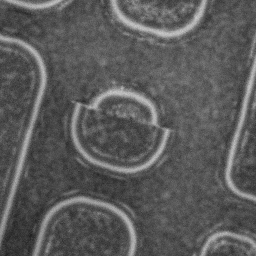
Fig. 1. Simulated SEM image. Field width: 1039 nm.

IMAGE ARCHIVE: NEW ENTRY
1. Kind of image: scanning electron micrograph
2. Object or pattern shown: one or a few lines or trenches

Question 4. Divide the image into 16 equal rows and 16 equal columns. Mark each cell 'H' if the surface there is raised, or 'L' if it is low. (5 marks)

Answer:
LLLLLLLHHHHHHLLL
LLLLLLLLHHHHLLLL
HLLLLLLLLLLLLLLL
HHLLLLLLLLLLLLLL
HHHLLLLLLLLLLLLL
HHHLLLLLLLLLLLLL
HHLLLLHHHLLLLLLH
HHLLLHHHHHLLLLLH
HHLLLHHHHHLLLLLH
HLLLLHHHHHLLLLLH
HLLLLLLHHLLLLLHH
HLLLLLLLLLLLLLHH
HLLLLLLLLLLLLLLL
LLLHHHHHLLLLLLLL
LLLHHHHHLLLLLLLL
LLHHHHHHLLLLLHHH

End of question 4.